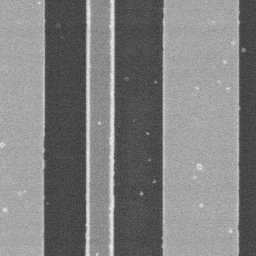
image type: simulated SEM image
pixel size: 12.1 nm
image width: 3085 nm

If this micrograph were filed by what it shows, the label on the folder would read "lines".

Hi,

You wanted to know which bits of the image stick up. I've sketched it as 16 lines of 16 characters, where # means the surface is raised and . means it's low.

###..##...#####.
###..##...#####.
###..##...#####.
###..##...#####.
###..##...#####.
###..##...#####.
###..##...#####.
###..##...#####.
###..##...#####.
###..##...#####.
###..##...#####.
###..##...#####.
###..##...#####.
###..##...#####.
###..##...#####.
###..##...#####.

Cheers